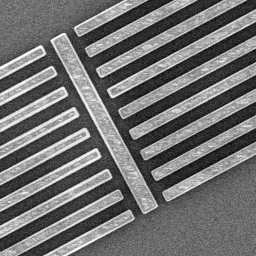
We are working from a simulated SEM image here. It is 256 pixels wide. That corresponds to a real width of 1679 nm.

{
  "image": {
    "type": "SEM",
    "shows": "groups of lines, slits or small figures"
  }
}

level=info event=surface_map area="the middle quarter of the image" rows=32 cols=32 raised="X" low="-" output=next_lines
XXXX------XXXXX-------XXXXX-----
-XXXX---XXXXX-------XXXXX-------
-XXXXX---XX-------XXXXX-------XX
--XXXX----------XXXXXX-------XXX
--XXXXX--------XXXXX-------XXXXX
---XXXX-----XXXXXX-------XXXXX--
---XXXXX---XXXXX-------XXXXX----
X---XXXX---XXX-------XXXXX------
-----XXXX----------XXXXXX-------
-----XXXX--------XXXXXX------XXX
------XXXX-----XXXXXX-------XXXX
--X---XXXX----XXXXX-------XXXXX-
XXX----XXXX---XXX-------XXXXXX--
XX-----XXXX-----------XXXXXX----
--------XXXX--------XXXXXX------
--------XXXXX-----XXXXXX-------X
---------XXXX----XXXXX-------XXX
---XXX---XXXXX---XXX-------XXXXX
-XXXX-----XXXX---X-------XXXXXX-
XXX--------XXXX--------XXXXXX---
X----------XXXX------XXXXXX-----
-----------XXXXX---XXXXXX-------
------XXX---XXXX---XXXX-------XX
----XXXXX---XXXXX---XX------XXXX
--XXXX-------XXXXX--------XXXXXX
XXXXX---------XXXX------XXXXXX--
XXX-----------XXXX-----XXXXX----
X--------XX----XXXX---XXXX------
-------XXXX----XXXXX--XX-------X
-----XXXXX------XXXX---------XXX
---XXXXX--------XXXXX-------XXXX
-XXXXX-------X---XXXX-----XXXXX-